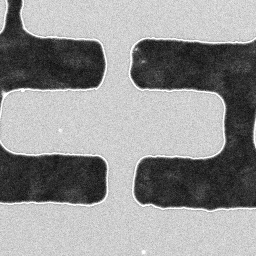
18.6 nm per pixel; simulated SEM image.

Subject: one or a few lines or trenches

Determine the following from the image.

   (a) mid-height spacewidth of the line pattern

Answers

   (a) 1200 nanometres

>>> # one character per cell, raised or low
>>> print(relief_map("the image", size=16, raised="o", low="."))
o...............
o...............
oooooo...ooo....
ooooooo.oooooooo
ooooooo.oooooooo
oooooo...ooooooo
..............oo
..............oo
..............oo
o.............oo
ooooooo.oooooooo
ooooooo.oooooooo
oooooo...ooooooo
................
................
................